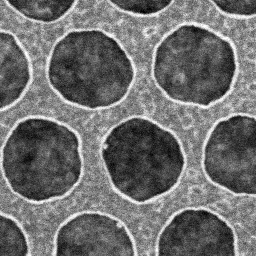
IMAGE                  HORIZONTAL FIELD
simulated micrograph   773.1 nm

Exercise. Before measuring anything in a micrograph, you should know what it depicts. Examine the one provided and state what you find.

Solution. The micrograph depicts holes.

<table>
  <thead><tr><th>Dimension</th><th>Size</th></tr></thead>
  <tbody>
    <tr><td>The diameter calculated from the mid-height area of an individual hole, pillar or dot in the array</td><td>249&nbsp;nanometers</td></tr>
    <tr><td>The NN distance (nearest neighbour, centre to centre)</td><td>306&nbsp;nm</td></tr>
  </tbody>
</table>